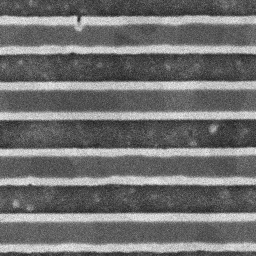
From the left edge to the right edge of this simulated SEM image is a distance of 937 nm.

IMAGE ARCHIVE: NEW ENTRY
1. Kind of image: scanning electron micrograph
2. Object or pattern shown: one or a few lines or trenches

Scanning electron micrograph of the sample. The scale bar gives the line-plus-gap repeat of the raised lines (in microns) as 0.241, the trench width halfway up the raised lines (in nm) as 131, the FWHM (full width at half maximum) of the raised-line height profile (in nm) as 111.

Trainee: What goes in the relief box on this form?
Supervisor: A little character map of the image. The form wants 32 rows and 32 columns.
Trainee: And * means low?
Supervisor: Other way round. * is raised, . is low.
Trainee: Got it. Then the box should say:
................................
................................
..**............*......****....*
********************************
********************************
********************************
................................
................................
................................
................................
................................
********************************
********************************
********************************
.**....*.*************..........
................................
................................
................................
................................
********************************
********************************
********************************
**************.*****************
................................
................................
................................
................................
********************************
********************************
********************************
********************************
................................